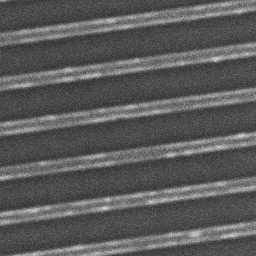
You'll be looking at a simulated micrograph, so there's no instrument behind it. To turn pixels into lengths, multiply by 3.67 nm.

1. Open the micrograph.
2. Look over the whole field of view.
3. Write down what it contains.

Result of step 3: parallel lines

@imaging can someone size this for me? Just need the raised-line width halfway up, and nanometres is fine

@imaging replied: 41.7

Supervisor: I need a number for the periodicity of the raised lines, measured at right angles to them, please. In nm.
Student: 162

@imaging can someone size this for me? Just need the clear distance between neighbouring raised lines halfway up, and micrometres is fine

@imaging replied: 0.118